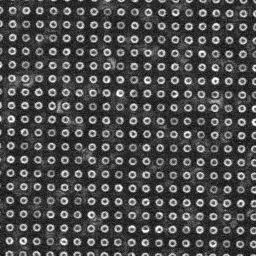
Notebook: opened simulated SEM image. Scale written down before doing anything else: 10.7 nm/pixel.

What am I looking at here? a regular array of raised bodies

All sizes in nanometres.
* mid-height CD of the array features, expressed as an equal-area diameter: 72.3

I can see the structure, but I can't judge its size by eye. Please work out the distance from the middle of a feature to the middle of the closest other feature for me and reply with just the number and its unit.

140 nm